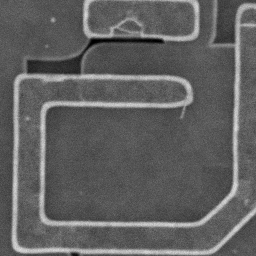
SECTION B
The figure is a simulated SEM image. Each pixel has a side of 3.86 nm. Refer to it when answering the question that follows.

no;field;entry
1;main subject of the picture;wiring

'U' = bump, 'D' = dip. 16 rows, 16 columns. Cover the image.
DDDDDUUUUUUUDDDD
DDDDDUUUUUUUDDDD
DDDDDDDDDDDDDDDU
DDDDDDDDDDDDDDDU
DDDDDDDDDDDDDDDU
DUUUUUUUUUUUDDDU
DUUUDDUUUUUDDDDU
DUUDDDDDDDDDDDDU
DUUDDDDDDDDDDDDU
DUUDDDDDDDDDDDDU
DUUDDDDDDDDDDDDU
DUUDDDDDDDDDDDDU
DUUDDDDDDDDDDDUU
DUUDDDDDDDDDDUUU
DUUUUUUUUUUUUUUD
DUUUUUUUUUUUUUDD